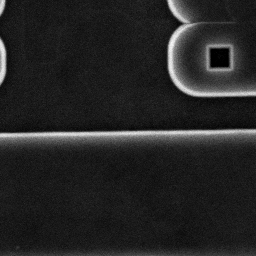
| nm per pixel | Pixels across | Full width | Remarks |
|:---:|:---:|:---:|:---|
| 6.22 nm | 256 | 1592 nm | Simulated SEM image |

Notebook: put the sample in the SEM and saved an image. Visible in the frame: wiring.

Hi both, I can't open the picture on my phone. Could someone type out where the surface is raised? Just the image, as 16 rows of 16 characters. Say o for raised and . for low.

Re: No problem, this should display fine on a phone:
...........ooooo
...........ooooo
...........ooooo
...........oo.oo
...........ooooo
...........ooooo
................
................
oooooooooooooooo
oooooooooooooooo
oooooooooooooooo
oooooooooooooooo
oooooooooooooooo
oooooooooooooooo
oooooooooooooooo
oooooooooooooooo